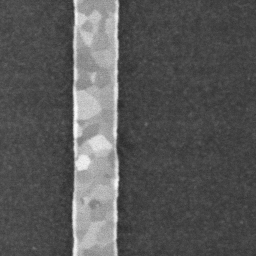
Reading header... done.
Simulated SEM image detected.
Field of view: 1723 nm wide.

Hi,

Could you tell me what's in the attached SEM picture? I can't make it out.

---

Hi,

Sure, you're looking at one or a few lines or trenches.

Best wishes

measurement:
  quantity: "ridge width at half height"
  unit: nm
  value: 280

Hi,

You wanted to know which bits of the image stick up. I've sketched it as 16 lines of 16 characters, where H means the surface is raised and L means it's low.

LLLLLHHLLLLLLLLL
LLLLLHHLLLLLLLLL
LLLLLHHLLLLLLLLL
LLLLLHHLLLLLLLLL
LLLLLHHLLLLLLLLL
LLLLLHHLLLLLLLLL
LLLLLHHLLLLLLLLL
LLLLLHHLLLLLLLLL
LLLLLHHLLLLLLLLL
LLLLLHHLLLLLLLLL
LLLLLHHLLLLLLLLL
LLLLLHHLLLLLLLLL
LLLLLHHLLLLLLLLL
LLLLLHHLLLLLLLLL
LLLLLHHLLLLLLLLL
LLLLLHHLLLLLLLLL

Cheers